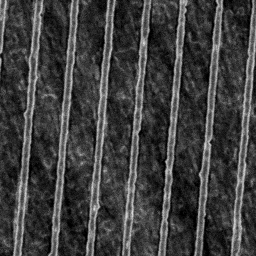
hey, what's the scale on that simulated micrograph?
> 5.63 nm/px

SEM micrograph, parallel lines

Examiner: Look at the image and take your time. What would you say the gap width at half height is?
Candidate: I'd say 165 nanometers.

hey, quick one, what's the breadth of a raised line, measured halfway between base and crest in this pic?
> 35.1 nm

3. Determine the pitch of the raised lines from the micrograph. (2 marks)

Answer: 203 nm